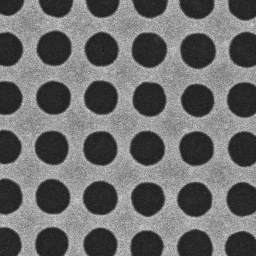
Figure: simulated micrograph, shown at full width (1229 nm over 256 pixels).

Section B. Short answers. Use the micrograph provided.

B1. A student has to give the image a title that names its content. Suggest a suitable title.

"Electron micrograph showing a regular array of holes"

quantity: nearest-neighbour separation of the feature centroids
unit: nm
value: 228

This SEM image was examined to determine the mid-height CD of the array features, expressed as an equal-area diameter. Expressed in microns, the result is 0.167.